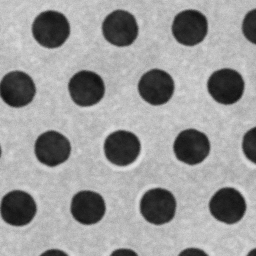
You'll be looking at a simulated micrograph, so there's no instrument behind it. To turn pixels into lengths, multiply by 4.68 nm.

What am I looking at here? a regular array of holes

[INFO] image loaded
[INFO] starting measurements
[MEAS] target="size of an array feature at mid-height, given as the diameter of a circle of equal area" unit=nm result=178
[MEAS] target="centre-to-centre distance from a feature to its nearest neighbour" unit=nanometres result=322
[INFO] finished